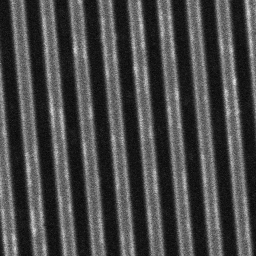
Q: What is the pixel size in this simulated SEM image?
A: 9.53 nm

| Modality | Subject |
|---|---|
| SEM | parallel lines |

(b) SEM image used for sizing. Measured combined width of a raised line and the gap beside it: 278 nm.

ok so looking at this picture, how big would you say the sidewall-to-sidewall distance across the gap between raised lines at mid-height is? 0.141 micrometres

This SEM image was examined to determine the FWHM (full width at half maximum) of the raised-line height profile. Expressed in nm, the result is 133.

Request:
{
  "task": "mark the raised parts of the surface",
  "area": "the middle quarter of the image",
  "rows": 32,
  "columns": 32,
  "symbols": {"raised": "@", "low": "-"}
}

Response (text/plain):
---@@@----@@@----@@@@----@@@----
---@@@----@@@----@@@@----@@@----
---@@@----@@@@---@@@@----@@@----
---@@@----@@@@----@@@----@@@----
---@@@@---@@@@----@@@----@@@----
---@@@@----@@@----@@@----@@@@---
---@@@@----@@@----@@@----@@@@---
---@@@@----@@@----@@@----@@@@---
---@@@@----@@@----@@@@---@@@@---
---@@@@----@@@----@@@@----@@@---
----@@@----@@@----@@@@----@@@---
----@@@----@@@----@@@@----@@@---
----@@@----@@@----@@@@----@@@---
----@@@----@@@@---@@@@----@@@---
----@@@----@@@@----@@@----@@@---
----@@@@---@@@@----@@@----@@@---
----@@@@----@@@----@@@----@@@@--
----@@@@----@@@----@@@----@@@@--
----@@@@----@@@----@@@----@@@@--
----@@@@----@@@----@@@@---@@@@--
@---@@@@----@@@----@@@@----@@@--
@----@@@----@@@----@@@@----@@@--
@----@@@----@@@----@@@@----@@@--
@----@@@----@@@----@@@@----@@@--
@----@@@----@@@@---@@@@----@@@--
@----@@@----@@@@----@@@----@@@--
@----@@@@---@@@@----@@@----@@@--
@----@@@@----@@@----@@@----@@@@-
@----@@@@----@@@----@@@----@@@@-
@----@@@@----@@@----@@@----@@@@-
@----@@@@----@@@----@@@@---@@@@-
@@---@@@@----@@@----@@@@----@@@-